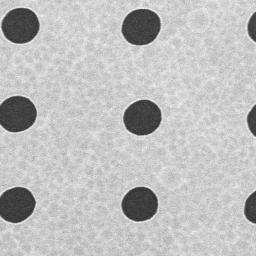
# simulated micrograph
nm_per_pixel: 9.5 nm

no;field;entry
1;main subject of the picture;holes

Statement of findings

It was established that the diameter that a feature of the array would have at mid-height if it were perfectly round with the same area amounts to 354 nm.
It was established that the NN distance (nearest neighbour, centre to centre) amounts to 843 nanometres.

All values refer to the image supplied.